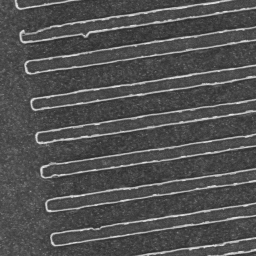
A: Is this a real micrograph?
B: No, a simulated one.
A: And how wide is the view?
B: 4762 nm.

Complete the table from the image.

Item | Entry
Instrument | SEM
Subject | parallel lines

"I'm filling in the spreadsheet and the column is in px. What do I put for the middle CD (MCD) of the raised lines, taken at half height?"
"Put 12.6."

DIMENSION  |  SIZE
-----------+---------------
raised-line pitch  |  634 nm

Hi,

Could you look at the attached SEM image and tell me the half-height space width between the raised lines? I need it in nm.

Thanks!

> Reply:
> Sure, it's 407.